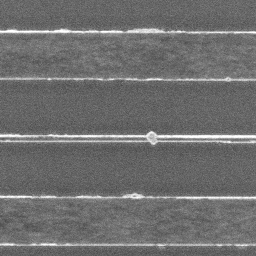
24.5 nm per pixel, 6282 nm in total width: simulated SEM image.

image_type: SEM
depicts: lines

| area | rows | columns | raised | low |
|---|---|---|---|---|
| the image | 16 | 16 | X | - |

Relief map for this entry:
----------------
----------------
XXXXXXXXXXXXXXXX
XXXXXXXXXXXXXXXX
XXXXXXXXXXXXXXXX
----------------
----------------
----------------
---------X------
----------------
----------------
----------------
XXXXXXXXXXXXXXXX
XXXXXXXXXXXXXXXX
XXXXXXXXXXXXXXXX
----------------